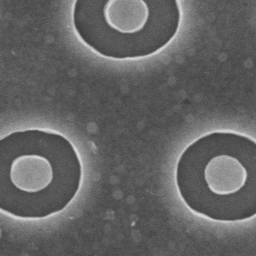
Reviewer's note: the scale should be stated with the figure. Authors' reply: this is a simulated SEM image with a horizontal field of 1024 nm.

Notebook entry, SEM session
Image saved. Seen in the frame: ring-shaped grooves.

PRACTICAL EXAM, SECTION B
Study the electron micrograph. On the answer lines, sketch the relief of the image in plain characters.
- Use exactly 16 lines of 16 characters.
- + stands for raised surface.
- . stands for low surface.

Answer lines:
+++++..++..+++++
+++++..++..+++++
+++++......+++++
+++++++..+++++++
++++++++++++++++
++++++++++++++++
++++++++++++++++
++++++++++++++++
....+++++++++..+
.....++++++.....
.++..++++++..++.
.++..++++++..++.
....+++++++.....
+..++++++++++...
++++++++++++++++
++++++++++++++++